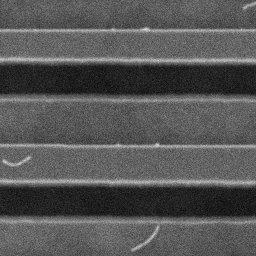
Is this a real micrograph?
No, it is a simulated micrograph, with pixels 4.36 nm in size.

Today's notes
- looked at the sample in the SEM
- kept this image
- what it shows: lines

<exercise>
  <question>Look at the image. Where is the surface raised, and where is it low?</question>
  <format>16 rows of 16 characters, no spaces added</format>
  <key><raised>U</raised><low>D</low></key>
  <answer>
UUUUUUUUUUUUUUUU
UUUUUUUUUUUUUUUU
UUUUUUUUUUUUUUUU
UUUUUUUUUUUUUUUU
DDDDDDDDDDDDDDDD
DDDDDDDDDDDDDDDD
UUUUUUUUUUUUUUUU
UUUUUUUUUUUUUUUU
UUUUUUUUUUUUUUUU
UUUUUUUUUUUUUUUU
UUUUUUUUUUUUUUUU
DDDDDDDDDDDDDDDD
DDDDDDDDDDDDDDDD
DDDDDDDDDDDDDDDD
UUUUUUUUUUUUUUUU
UUUUUUUUUUUUUUUU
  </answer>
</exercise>